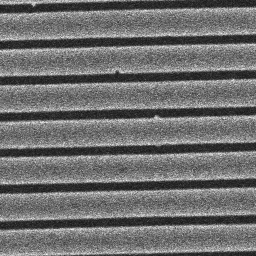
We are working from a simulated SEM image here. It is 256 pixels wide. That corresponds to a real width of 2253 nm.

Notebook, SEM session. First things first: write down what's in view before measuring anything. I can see parallel lines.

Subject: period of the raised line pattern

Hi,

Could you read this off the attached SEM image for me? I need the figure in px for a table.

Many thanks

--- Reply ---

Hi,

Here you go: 36.1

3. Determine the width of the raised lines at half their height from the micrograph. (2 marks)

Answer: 0.238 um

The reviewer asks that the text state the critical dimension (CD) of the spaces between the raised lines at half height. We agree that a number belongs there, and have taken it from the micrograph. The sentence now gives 0.0791 micrometres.